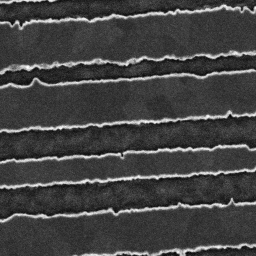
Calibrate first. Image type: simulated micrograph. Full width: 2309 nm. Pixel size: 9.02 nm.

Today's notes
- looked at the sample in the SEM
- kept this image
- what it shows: one or a few lines or trenches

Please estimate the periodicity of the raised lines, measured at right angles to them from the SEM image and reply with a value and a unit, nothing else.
578 nm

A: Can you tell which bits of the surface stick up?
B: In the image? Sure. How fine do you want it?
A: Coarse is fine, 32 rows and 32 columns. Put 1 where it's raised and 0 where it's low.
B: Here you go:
00000000000000000000000000000000
00000000000000000000001111111111
00000000111011111111111111111111
11111111111111111111111111111111
11111111111111111111111111111111
11111111111111111111111111111111
11111111111111111111111111111111
11111111111111111000000000000000
11110000000000000000000000000000
00000000000000000000111110111111
00001100111111111111111111111111
11111111111111111111111111111111
11111111111111111111111111111111
11111111111111111111111111111111
11111111111111111111111111110100
11111111111111000000000000000000
00000000000000000000000000000000
00000000000000000000000000000000
00000000000000000000000000011110
00000000000011111111111111111111
11111111111111111111111111111111
11111111111111111111111111111000
11111111111111000000000000000000
00000000000000000000000000000000
00000000000000000000000000000000
00000000000000000000000000001111
00000000000011011111111111111111
11111111111111111111111111111111
11111111111111111111111111111111
11111111111111111111111111111111
11111111111111111111111111111111
11111111111111111111101000000000